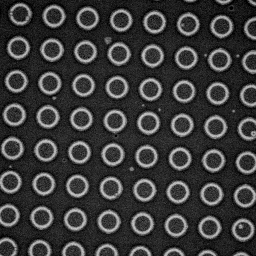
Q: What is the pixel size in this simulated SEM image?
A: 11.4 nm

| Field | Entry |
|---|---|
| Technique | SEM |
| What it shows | an array of small figures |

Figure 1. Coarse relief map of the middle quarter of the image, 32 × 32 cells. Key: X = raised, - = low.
---------------------XXX----XXXX
--------------------------------
----XX--------------------------
---XXXX----XXXX------X----------
--XXXXXX---XXXXX---XXXXX----XXXX
--XXXXXX--XXXXXX---XXXXX---XXXXX
--XXXXXX--XXXXXX---XXXXXX--XXXXX
---XXXX----XXXXX---XXXXX---XXXXX
------------XXX-----XXXX----XXXX
-----------------------------XX-
--------------------------------
--XXXX------XX------------------
--XXXXX---XXXXX----XXXX------XX-
-XXXXXX---XXXXXX---XXXXX---XXXXX
--XXXXX---XXXXXX--XXXXXX---XXXXX
--XXXXX---XXXXX---XXXXXX---XXXXX
---XX------XXXX----XXXXX---XXXXX
--------------------XX------XXX-
--------------------------------
---XX---------------------------
-XXXXX----XXXX-----XXX----------
-XXXXXX--XXXXXX---XXXXX----XXXX-
-XXXXXX--XXXXXX---XXXXXX--XXXXXX
-XXXXX---XXXXXX---XXXXX---XXXXXX
--XXXX----XXXX----XXXXX---XXXXXX
------------X------XXX-----XXXX-
-----------------------------X--
--------------------------------
-XXXX-----XXX-------------------
-XXXXX---XXXXX----XXXX-----XXX--
XXXXXX---XXXXXX--XXXXXX---XXXXX-
-XXXXX---XXXXXX--XXXXXX---XXXXX-